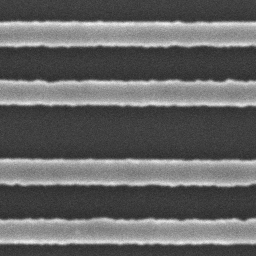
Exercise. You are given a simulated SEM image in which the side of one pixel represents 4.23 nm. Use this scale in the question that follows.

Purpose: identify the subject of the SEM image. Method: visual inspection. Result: lines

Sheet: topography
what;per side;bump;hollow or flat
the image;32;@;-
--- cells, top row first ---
--------------------------------
--------------------------------
--------------------------------
@@@@@@@@@@@@@@@@@@@@@@@@@@@@@@@@
@@@@@@@@@@@@@@@@@@@@@@@@@@@@@@@@
@@@@@@@@@@@@@@@@@@@@@@@@@@@@@@@@
--------------------------------
--------------------------------
--------------------------------
--------------------------------
@@@@@@@@@@@@@@@@@@@@@@@@@@@@@@@@
@@@@@@@@@@@@@@@@@@@@@@@@@@@@@@@@
@@@@@@@@@@@@@@@@@@@@@@@@@@@@@@@@
--------------------------------
--------------------------------
--------------------------------
--------------------------------
--------------------------------
--------------------------------
--------------------------------
@@@@@@@@@@@@@@@@@@@@@@@@@@@@@@@@
@@@@@@@@@@@@@@@@@@@@@@@@@@@@@@@@
@@@@@@@@@@@@@@@@@@@@@@@@@@@@@@@@
--------------------------------
--------------------------------
--------------------------------
--------------------------------
---@---@---@@@----@----------@-@
@@@@@@@@@@@@@@@@@@@@@@@@@@@@@@@@
@@@@@@@@@@@@@@@@@@@@@@@@@@@@@@@@
--------------------------------
--------------------------------